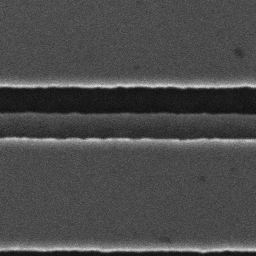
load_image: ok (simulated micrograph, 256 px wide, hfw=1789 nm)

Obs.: lines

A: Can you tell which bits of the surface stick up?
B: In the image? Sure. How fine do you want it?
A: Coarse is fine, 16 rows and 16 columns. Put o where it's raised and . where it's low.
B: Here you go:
oooooooooooooooo
oooooooooooooooo
oooooooooooooooo
oooooooooooooooo
oooooooooooooooo
................
................
...o.........o..
.ooo...o....o...
oooooooooooooooo
oooooooooooooooo
oooooooooooooooo
oooooooooooooooo
oooooooooooooooo
oooooooooooooooo
oooooooooooooooo